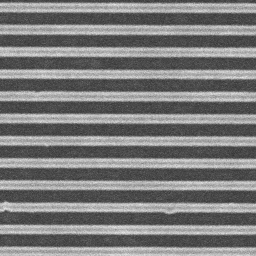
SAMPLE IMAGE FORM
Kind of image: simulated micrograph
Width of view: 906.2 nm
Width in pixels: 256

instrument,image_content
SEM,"parallel lines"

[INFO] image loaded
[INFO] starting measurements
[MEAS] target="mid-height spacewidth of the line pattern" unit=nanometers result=54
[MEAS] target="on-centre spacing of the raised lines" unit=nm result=78.6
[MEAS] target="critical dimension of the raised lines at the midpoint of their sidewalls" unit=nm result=23.4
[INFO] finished